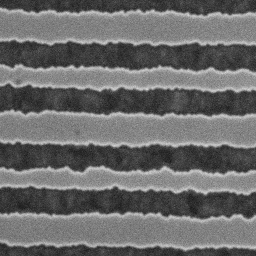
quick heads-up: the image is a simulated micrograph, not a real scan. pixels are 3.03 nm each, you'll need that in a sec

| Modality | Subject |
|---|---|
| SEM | lines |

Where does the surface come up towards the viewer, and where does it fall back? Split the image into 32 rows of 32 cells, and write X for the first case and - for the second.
--------------------------------
XXXX-XX-X-XXX--XXXXXXX----------
XXXXXXXXXXXXXXXXXXXXXXXXXXXXXXXX
XXXXXXXXXXXXXXXXXXXXXXXXXXXXXXXX
XXXXXXXXXXXXXXXXXXXXXXXXXXXXXXXX
------X----------XXXXXX--XX-XXXX
--------------------------------
--------------------------------
XXXX--XXXXXXX------XX-----------
XXXXXXXXXXXXXXXXXXXXXXXXXXXXXXXX
XXXXXXXXXXXXXXXXXXXXXXXXXXXXXXXX
--------------------------------
----------------------X---------
--------------------------------
XXXXXXXXXXXXXXXXXXXXXXXXXXXXXXXX
XXXXXXXXXXXXXXXXXXXXXXXXXXXXXXXX
XXXXXXXXXXXXXXXXXXXXXXXXXXXXXXXX
XXXXXXXXXXXXXXXXXXXXXXXXXXXXXXXX
------------------------------XX
--------------------------------
--------------------------------
XXXXXXXXXXXXXXX-XXXXXX--X------X
XXXXXXXXXXXXXXXXXXXXXXXXXXXXXXXX
------XXXXXXXX-XXXXXXXXXXXXXXXXX
--------------------------------
--------------------------------
--------------------------------
XXXXXXXXXXXXXXXXXXXXXXXXXXXXXXXX
XXXXXXXXXXXXXXXXXXXXXXXXXXXXXXXX
XXXXXXXXXXXXXXXXXXXXXXXXXXXXXXXX
-XXXXXXXXXXXXXXXXXXXXXXXXXXXXXXX
--------------------------------